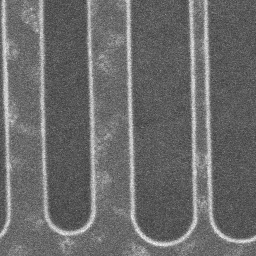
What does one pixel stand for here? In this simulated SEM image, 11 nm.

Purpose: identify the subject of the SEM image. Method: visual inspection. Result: one or a few lines or trenches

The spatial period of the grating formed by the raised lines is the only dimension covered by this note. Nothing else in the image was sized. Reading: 968 nanometers